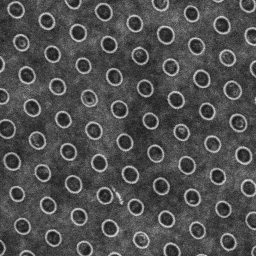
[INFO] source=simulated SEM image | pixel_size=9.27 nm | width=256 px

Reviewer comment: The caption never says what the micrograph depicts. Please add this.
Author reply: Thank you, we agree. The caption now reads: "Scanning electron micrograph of a regular array of raised bodies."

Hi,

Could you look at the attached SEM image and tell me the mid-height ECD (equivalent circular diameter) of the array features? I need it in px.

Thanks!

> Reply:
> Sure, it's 16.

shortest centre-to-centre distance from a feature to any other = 304 nanometres